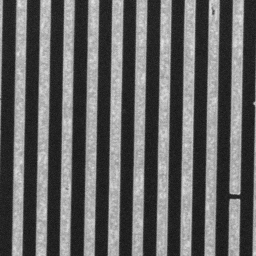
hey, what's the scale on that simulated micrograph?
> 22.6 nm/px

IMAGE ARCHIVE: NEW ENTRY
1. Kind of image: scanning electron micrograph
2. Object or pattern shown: parallel lines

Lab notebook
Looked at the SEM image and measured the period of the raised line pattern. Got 543 nm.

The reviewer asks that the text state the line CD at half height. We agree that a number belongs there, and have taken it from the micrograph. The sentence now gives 220 nanometres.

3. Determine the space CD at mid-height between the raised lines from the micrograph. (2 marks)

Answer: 0.313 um